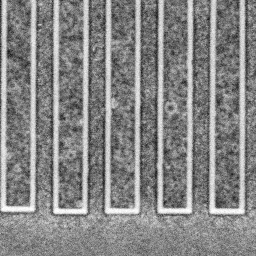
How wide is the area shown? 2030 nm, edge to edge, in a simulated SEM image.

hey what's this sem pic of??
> parallel lines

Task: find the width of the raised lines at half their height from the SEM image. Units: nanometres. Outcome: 235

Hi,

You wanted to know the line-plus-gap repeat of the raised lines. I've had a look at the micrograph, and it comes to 0.415 micrometres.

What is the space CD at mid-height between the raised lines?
182 nm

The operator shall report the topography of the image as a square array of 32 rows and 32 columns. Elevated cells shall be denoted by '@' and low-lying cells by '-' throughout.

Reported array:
-@@@---@@@@---@@@---@@@@---@@@--
-@@@---@@@@---@@@---@@@@---@@@--
-@@@---@@@@---@@@---@@@@---@@@--
-@@@---@@@@---@@@---@@@@---@@@--
-@@@---@@@@---@@@---@@@@---@@@--
-@@@---@@@@---@@@---@@@@---@@@--
-@@@---@@@@---@@@---@@@@---@@@--
-@@@---@@@@---@@@---@@@@---@@@--
-@@@---@@@@---@@@---@@@@---@@@--
@@@@---@@@@---@@@---@@@@---@@@--
@@@@---@@@@---@@@---@@@@---@@@--
@@@@---@@@@---@@@---@@@@---@@@--
@@@@---@@@@---@@@---@@@@---@@@--
@@@@---@@@@---@@@---@@@@---@@@--
@@@@---@@@@---@@@---@@@@---@@@--
@@@@---@@@@---@@@---@@@@---@@@--
@@@@---@@@@--@@@@---@@@@---@@@--
@@@@---@@@@--@@@@---@@@@---@@@--
@@@@---@@@@--@@@@---@@@@---@@@--
@@@@---@@@@--@@@@---@@@@---@@@--
@@@@---@@@@--@@@@---@@@@---@@@--
@@@@---@@@@--@@@@---@@@@---@@@--
@@@@---@@@@--@@@@---@@@@---@@@--
@@@@---@@@@--@@@@---@@@@---@@@--
@@@@---@@@@--@@@@---@@@@---@@@--
@@@@---@@@@--@@@@---@@@@---@@@--
--------------------------------
--------------------------------
--------------------------------
--------------------------------
--------------------------------
--------------------------------